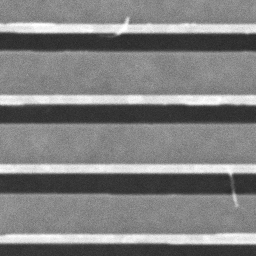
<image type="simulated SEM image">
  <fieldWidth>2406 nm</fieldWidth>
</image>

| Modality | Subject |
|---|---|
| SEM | lines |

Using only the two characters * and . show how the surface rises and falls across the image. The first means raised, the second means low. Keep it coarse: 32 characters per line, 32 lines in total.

********************************
********************************
********************************
********************************
................................
................................
*****...***...................**
********************************
********************************
********************************
********************************
********************************
********************************
................................
................................
................................
********************************
********************************
********************************
********************************
********************************
********************************
................................
................................
********************************
********************************
********************************
********************************
********************************
********************************
................................
................................